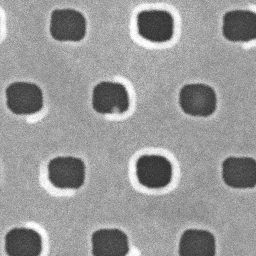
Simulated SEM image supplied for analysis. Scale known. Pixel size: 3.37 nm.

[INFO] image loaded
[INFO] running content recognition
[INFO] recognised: holes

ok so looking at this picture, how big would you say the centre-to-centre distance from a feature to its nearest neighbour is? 284 nm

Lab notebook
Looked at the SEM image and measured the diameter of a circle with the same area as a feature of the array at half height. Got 125 nm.